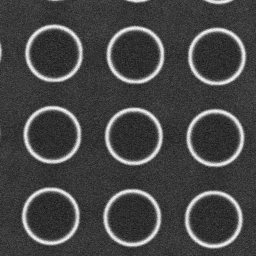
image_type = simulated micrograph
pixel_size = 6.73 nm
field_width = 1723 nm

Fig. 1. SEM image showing an array of small figures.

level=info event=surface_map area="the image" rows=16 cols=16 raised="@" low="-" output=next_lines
----------------
----------------
--@@@--@@@--@@@-
--@@@--@@@--@@@-
--@@@--@@@--@@@-
----------------
----------------
--@@@--@@@--@@@-
--@@@--@@@--@@@-
--@@@--@@@--@@@-
----------------
----------------
--@@@--@@@--@@@-
-@@@@--@@@--@@@-
--@@@--@@@--@@@-
----------------